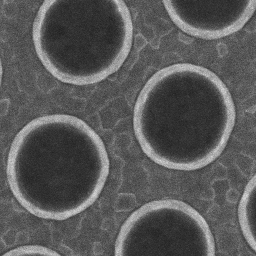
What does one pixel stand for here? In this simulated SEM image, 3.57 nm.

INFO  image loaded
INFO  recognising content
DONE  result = raised bodies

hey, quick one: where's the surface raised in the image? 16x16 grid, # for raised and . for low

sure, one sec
...#####...#####
..######...####.
..######........
...#####........
...####...###...
.........#####..
.........#####..
...#.....#####..
.#####...#####..
.#####...####...
.######.........
.#####..........
.#####.........#
.........###...#
........#####..#
.......######...